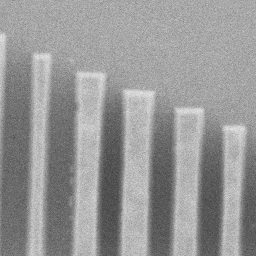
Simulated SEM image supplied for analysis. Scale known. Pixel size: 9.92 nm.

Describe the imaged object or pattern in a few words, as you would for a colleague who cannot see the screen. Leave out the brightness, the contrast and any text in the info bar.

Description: parallel lines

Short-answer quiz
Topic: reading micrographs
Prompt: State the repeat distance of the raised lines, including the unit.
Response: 485 nm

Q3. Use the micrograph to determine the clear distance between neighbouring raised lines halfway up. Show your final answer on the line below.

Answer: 252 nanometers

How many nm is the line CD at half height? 224